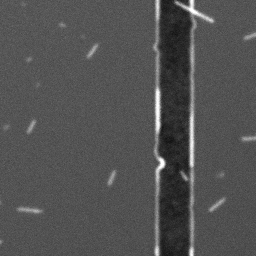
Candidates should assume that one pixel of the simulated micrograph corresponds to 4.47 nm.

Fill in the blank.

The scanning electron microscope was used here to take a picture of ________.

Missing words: one or a few lines or trenches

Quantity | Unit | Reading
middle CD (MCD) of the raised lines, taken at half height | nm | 163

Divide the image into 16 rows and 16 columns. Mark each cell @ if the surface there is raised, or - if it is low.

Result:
----------@@----
----------@@----
----------@@----
----------@@----
----------@@----
----------@@----
----------@@----
----------@@----
----------@@----
----------@@----
----------@@----
----------@@----
----------@@----
----------@@----
----------@@----
----------@@----